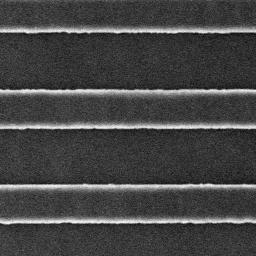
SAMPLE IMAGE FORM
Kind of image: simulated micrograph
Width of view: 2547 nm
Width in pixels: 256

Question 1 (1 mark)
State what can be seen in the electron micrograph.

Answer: lines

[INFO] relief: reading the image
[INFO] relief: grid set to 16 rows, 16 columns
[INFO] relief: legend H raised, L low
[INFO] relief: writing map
HHHHHHHHHHHHHHHH
HHHHHHHHHHHHHHHH
LLLLLLLLLLLLLLLL
LLLLLLLLLLLLLLLL
LLLLLLLLLLLLLLLL
LLLLLLLLLLLLLLLL
HHHHHHHHHHHHHHHH
HHHHHHHHHHHHHHHH
LLLLLLLLLLLLLLLL
LLLLLLLLLLLLLLLL
LLLLLLLLLLLLLLLL
LLLLLLLLLLLLLLLL
HHHHHHHHHHHHHHHH
HHHHHHHHHHHHHHHH
LLLLLLLLLLLLLLLL
LLLLLLLLLLLLLLLL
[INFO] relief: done